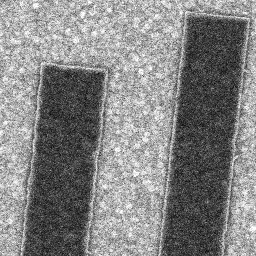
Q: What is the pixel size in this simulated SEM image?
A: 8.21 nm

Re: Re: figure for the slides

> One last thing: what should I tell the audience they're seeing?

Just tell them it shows one or a few lines or trenches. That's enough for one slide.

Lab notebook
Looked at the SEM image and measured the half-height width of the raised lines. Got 64.2 pixels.